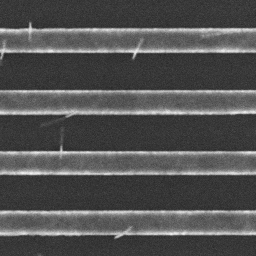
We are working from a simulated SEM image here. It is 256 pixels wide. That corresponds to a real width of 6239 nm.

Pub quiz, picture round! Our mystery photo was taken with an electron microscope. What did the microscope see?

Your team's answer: lines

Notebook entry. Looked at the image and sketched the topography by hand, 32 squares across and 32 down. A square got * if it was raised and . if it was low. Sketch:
................................
................................
................................
................................
********************************
********************************
********************************
................................
................................
................................
................................
********************************
********************************
********************************
................................
................................
................................
................................
................................
********************************
********************************
********************************
................................
................................
................................
................................
*****..*************************
********************************
********************************
..............*.................
................................
................................